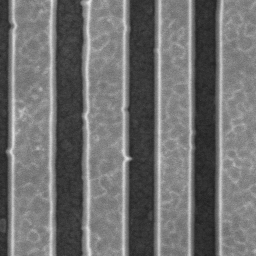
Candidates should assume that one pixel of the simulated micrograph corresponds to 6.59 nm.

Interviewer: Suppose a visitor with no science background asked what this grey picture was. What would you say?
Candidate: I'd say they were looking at one or a few lines or trenches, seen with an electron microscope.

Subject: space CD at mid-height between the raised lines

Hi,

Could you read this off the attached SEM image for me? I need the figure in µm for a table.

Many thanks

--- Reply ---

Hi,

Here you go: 0.204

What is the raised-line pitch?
469 nm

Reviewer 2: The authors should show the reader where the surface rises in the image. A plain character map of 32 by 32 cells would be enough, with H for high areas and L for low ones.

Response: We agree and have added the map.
LHHHHHHLLLLHHHHHLLLLHHHHLLLLHHHH
LHHHHHHLLLLHHHHHLLLLHHHHLLLHHHHH
LHHHHHHLLLLHHHHHLLLLHHHHLLLHHHHH
LLHHHHHLLLLHHHHHLLLLHHHHLLLHHHHH
LHHHHHHLLLLHHHHHLLLLHHHHLLLHHHHH
LHHHHHHLLLLHHHHHLLLLHHHHLLLHHHHH
LHHHHHHLLLLHHHHHLLLLHHHHLLLHHHHH
LHHHHHHLLLLHHHHHLLLLHHHHLLLHHHHH
LHHHHHHLLLLHHHHHLLLLHHHHLLLHHHHH
LHHHHHHLLLLHHHHHLLLLHHHHLLLHHHHH
LHHHHHHLLLLHHHHHLLLLHHHHLLLHHHHH
LHHHHHHLLLLHHHHHLLLLHHHHLLLHHHHH
LHHHHHHLLLLHHHHHLLLLHHHHLLLHHHHH
LHHHHHHLLLLHHHHHLLLLHHHHLLLHHHHH
LHHHHHHLLLLHHHHHLLLLHHHHLLLHHHHH
LHHHHHHLLLLHHHHHLLLLHHHHLLLHHHHH
LHHHHHHLLLLHHHHHLLLLHHHHLLLHHHHH
LHHHHHHLLLLHHHHHLLLLHHHHLLLHHHHH
LHHHHHHLLLLHHHHHLLLLHHHHLLLHHHHH
LHHHHHLLLLLHHHHHLLLLHHHHLLLHHHHH
LHHHHHLLLLLHHHHHLLLLHHHHLLLHHHHH
LHHHHHHLLLLHHHHHLLLLHHHHLLLHHHHH
LHHHHHHLLLLHHHHHLLLLHHHHLLLHHHHH
LHHHHHHLLLLHHHHHLLLLHHHHLLLHHHHH
LHHHHHHLLLLHHHHHLLLLHHHHLLLHHHHH
LHHHHHHLLLLHHHHHLLLLHHHHLLLHHHHH
LHHHHHHLLLLHHHHHLLLLHHHHLLLHHHHH
LHHHHHHLLLLHHHHHLLLLHHHHLLLHHHHH
LHHHHHHLLLLHHHHHLLLLHHHHLLLHHHHH
LHHHHHHLLLLHHHHHLLLLHHHHLLLHHHHH
LHHHHHHLLLLHHHHHLLLLHHHHLLLHHHHH
LHHHHHHLLLLHHHHHLLLLHHHHLLLHHHHH